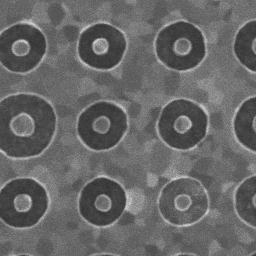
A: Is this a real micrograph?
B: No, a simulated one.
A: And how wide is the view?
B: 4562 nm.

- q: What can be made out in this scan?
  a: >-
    ring-shaped grooves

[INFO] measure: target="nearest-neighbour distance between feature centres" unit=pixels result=76.6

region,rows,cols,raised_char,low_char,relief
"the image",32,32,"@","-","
@@@@@@@@@@@@@@@@@@@@@@@@@@@@@@@@
@@@@@@@@@@@@@@@@@@@@@@@@@@@@@@@@
@@@@@@@@@@@@@@@@@@@@@@@@@@@@@@@@
@----@@@@@@---@@@@@@@----@@@@@--
-----@@@@@-----@@@@@-----@@@@---
--@@--@@@@--@---@@@---@@--@@@---
--@---@@@@--@---@@@@--@@--@@@---
-----@@@@@-----@@@@@-----@@@@@--
@---@@@@@@@@--@@@@@@@---@@@@@@@-
@@@@@@@@@@@@@@@@@@@@@@@@@@@@@@@@
@@@@@@@@@@@@@@@@@@@@@@@@@@@@@@@@
@@@@@@@@@@@@@@@@@@@@@@@@@@@@@@@@
------@@@@@@@@@@@@@@@@-@@@@@@@@-
-------@@@@----@@@@@-----@@@@@--
--@@---@@@------@@@@------@@@---
-@@@---@@@--@@--@@@@--@@--@@@---
--@@---@@@--@---@@@@--@---@@@---
------@@@@-----@@@@@-----@@@@@--
------@@@@@---@@@@@@@@--@@@@@@@-
@---@@@@@@@@@@@@@@@@@@@@@@@@@@@@
@@@@@@@@@@@@@@@@@@@@@@@@@@@@@@@@
@@@@@@@@@@@@@@@@@@@@@@@@@@@@@@@@
@@--@@@@@@@@--@@@@@@@@--@@@@@@@-
-----@@@@@@----@@@@@@----@@@@@--
--@---@@@@------@@@@@-@---@@@---
--@@--@@@@--@@--@@@@@-@@--@@@---
------@@@@-----@@@@@@-----@@@@--
-----@@@@@@---@@@@@@@@---@@@@@--
@@@@@@@@@@@@@@@@@@@@@@@@@@@@@@@@
@@@@@@@@@@@@@@@@@@@@@@@@@@@@@@@@
@@@@@@@@@@@@@@@@@@@@@@@@@@@@@@@@
@@@@@@@@@@@@@@@@@@@@@@@@@@@@@@@@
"